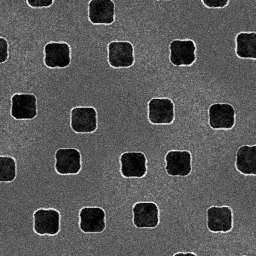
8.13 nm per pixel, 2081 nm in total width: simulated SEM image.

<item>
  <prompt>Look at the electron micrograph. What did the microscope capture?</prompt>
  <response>a regular array of holes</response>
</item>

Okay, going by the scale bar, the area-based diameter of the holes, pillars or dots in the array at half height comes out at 27.1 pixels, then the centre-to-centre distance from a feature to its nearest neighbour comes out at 438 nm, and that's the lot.